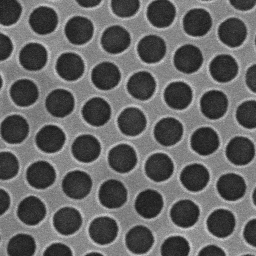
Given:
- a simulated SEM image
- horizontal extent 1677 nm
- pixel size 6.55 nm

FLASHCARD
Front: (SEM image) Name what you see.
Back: a regular array of holes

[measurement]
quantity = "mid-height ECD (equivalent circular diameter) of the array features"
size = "30.1 pixels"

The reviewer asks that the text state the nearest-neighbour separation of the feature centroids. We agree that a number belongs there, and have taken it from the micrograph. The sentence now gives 243 nanometres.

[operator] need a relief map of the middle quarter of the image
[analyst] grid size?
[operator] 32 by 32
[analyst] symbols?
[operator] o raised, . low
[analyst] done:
.....ooo.....oooooooooooooo.....
.....oo.......oooooooooooooo....
.....oo.......ooo.....ooooooooo.
....ooo.......oo.......ooooooooo
o.ooooo.......oo.......oooo...oo
oooooooo.....oo........ooo......
.oooooooo...oooo.......oo.......
..oooooooooooooo......ooo.......
...oooo...ooooooo.....ooo.......
...oo......oooooooooooooo.......
...oo.......oooooooooooooo.....o
..oo........ooo....ooooooooo..oo
.ooo........oo......oooooooooooo
ooooo.......o........oooo...oooo
ooooo......oo........oo......ooo
ooooooo...ooo........oo.......oo
oooooooooooooo......oo........oo
ooooo.ooooooooo....ooo........oo
.oo.....oooooooooooooo.......oo.
oo.......oooooooooooooo......oo.
oo.......oooo....oooooooo..ooooo
oo.......oo.......oooooooooooooo
oo.......oo.......oooo....oooooo
oo......ooo.......ooo......ooooo
oooo...oooo.......oo.......ooooo
ooooooooooo.......oo........oo..
ooo.oooooooo.....ooo........o...
o.....oooooooo.ooooo.......oo...
.......oooooooooooooo.....ooo...
.......ooo....ooooooooo..oooo...
.......oo......ooooooooooooooo..
.......oo.......oooo...oooooooo.